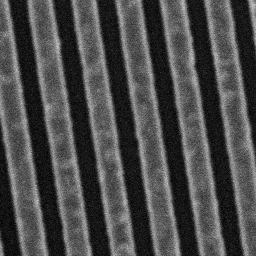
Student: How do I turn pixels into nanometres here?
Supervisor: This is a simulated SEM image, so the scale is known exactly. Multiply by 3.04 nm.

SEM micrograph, parallel lines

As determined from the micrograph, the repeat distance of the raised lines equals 133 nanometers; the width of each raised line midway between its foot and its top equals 72.5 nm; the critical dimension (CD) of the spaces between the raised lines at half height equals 0.062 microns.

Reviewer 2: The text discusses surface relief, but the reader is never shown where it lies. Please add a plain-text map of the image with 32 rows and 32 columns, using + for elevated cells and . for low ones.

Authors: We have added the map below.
+...++...+++...+++..+++...+++..+
+...+++..+++...+++..+++...+++..+
+...+++..+++...+++..+++...+++...
++..+++...++...+++...+++..+++...
++..+++...+++..+++...+++..+++...
++..+++...+++..+++...+++..+++...
++..+++...+++...+++..+++...+++..
++...+++..+++...+++..+++...+++..
++...+++..+++...+++..+++...+++..
++...+++...++...+++...+++..+++..
+++..+++...+++..+++...+++..+++..
+++..+++...+++..+++...+++..+++..
+++..+++...+++..++++..+++...+++.
+++...+++..+++...+++..+++...+++.
+++...+++..+++...+++..+++...+++.
+++...+++..+++...+++...++...+++.
+++...+++...+++..+++...+++..+++.
.+++..+++...+++..+++...+++..+++.
.+++..+++...+++..+++...+++..++++
.+++...++...+++...+++..+++...+++
.+++...+++..+++...+++..+++...+++
.+++...+++..+++...+++..+++...+++
.+++...+++..+++...+++...+++..+++
.++++..+++...+++..+++...+++..+++
..+++..+++...+++..+++...+++..+++
..+++..+++...+++..+++...+++...++
..+++...+++..+++...+++..+++...++
..+++...+++..+++...+++..+++...++
..+++...+++..+++...+++..+++...++
..++++..+++...++...+++...+++..++
...+++..+++...+++..+++...+++..++
...+++..+++...+++..+++...+++...+